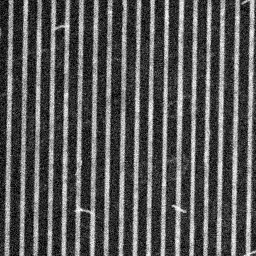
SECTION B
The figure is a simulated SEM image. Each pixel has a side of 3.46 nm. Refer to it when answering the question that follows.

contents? parallel lines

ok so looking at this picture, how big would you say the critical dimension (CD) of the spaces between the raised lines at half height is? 39 nanometers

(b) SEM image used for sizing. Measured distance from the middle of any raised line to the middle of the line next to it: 49.1 nanometres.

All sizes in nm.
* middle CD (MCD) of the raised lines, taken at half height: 12.1